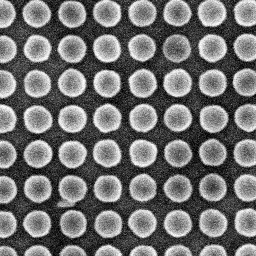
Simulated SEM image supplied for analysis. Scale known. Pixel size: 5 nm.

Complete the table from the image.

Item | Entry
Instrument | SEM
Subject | a regular array of raised bodies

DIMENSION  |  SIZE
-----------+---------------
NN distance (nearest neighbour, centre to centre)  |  0.174 micrometres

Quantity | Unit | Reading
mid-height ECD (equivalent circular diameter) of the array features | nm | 133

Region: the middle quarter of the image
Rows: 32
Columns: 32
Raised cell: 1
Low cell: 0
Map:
00000000000000000000000000000000
01100000000000000000000000001000
11110000111110000011110000111110
11111000111111000111111001111111
11111000111111000111111001111111
11111000111111000111111001111111
11111000111111000111111001111110
11110000011110000011100000011100
00000000000000000000000000000000
00000000000000000000000000000000
00000000001100000001100000011100
11111000111110000111111000111110
11111000111111000111111001111111
11111000111111000111111001111111
11111000111111000111111001111111
11111000111111000111110000111110
01110000011100000011100000011100
00000000000000000000000000000000
00000000000000000000000000000000
00000000011110000011100000011100
11111000111110000111110000111110
11111001111111000111111001111111
11111001111111000111111001111111
11111000111111000111111000111111
11111000111111000111110000111110
11110000001100000001100000001100
00000000000000000000000000000000
00000000000000000000000000000000
11110000011110000011110000011100
11111000111111000111111000111110
11111000111111000111111001111111
11111000111111000111111001111111